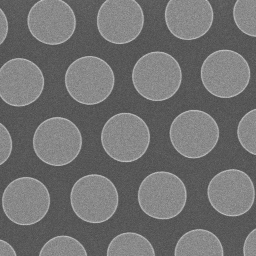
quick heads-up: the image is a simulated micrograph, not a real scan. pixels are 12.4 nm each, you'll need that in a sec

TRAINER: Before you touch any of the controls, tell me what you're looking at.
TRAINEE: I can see an array of small figures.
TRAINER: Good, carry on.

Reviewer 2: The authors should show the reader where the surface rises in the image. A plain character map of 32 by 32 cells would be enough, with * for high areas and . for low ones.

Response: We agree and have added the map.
....****.....****....*****...***
....*****...******...******..***
*...*****...******...******..***
*...*****...******...*****....**
*...*****....****.....***......*
......*.........................
...................*.......**...
.**.......***....*****....*****.
*****....*****...******..******.
*****...******...******..******.
*****...******...******..******.
*****....*****...*****....****..
****.....****......*............
................................
..............***.....****.....*
.....****....*****....*****...**
*...******...******..******...**
*...******...******..******...**
*...******...*****....*****....*
*....*****....****.....**.......
......**........................
....................*.......**..
..***.....****....*****...*****.
.*****...*****...******...******
******...******..******...******
******...******..******...******
.*****...*****....*****....****.
.****.....***...................
................................
...............***.....****....*
*.....****....*****...******...*
**...******..******...******..**